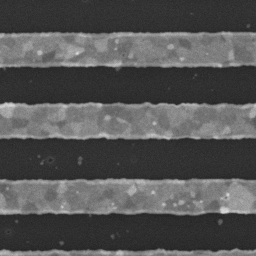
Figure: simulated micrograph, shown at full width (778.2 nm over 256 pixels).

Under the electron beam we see lines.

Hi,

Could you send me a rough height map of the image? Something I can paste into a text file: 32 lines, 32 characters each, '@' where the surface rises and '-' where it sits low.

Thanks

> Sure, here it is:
--------------------------------
--------------------------------
--------------------------------
--------------------------------
@@@@@@@@@@@@@@@@@@@@@@@@@@@@@@@@
@@@@@@@@@@@@@@@@@@@@@@@@@@@@@@@@
@@@@@@@@@@@@@@@@@@@@@@@@@@@@@@@@
@@@@@@@@@@@@@@@@@@@@@@@@@@@@@@@@
--------------------------------
--------------------------------
--------------------------------
--------------------------------
--------------------------------
@@@@@@@@@@@@@@@@@@@@@@@@@@@@@@@@
@@@@@@@@@@@@@@@@@@@@@@@@@@@@@@@@
@@@@@@@@@@@@@@@@@@@@@@@@@@@@@@@@
@@@@@@@@@@@@@@@@@@@@@@@@@@@@@@@@
--------------------------------
--------------------------------
--------------------------------
--------------------------------
--------------------------------
@---@@---@@-@@@@@@--@@@@@@@@@@@-
@@@@@@@@@@@@@@@@@@@@@@@@@@@@@@@@
@@@@@@@@@@@@@@@@@@@@@@@@@@@@@@@@
@@@@@@@@@@@@@@@@@@@@@@@@@@@@@@@@
@@@@@@@@@@@@@@@@@@@@@@@@@@@@@@@@
--------------------------------
--------------------------------
--------------------------------
--------------------------------
@@@@@@@@@@@@@@@@@@@@@@@@@@@@@@@@